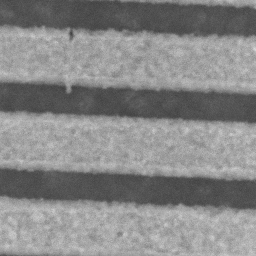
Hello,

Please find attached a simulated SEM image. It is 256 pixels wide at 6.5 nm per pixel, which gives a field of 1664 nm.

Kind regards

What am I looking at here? one or a few lines or trenches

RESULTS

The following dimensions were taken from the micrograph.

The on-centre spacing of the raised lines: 0.559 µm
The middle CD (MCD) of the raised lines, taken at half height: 286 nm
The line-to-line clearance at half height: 274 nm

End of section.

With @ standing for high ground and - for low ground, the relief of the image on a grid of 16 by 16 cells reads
----------------
----------------
@@@@@@@@@@@-----
@@@@@@@@@@@@@@@@
@@@@@@@@@@@@@@@@
----------------
----------------
@@@@------------
@@@@@@@@@@@@@@@@
@@@@@@@@@@@@@@@@
---------@@@@@@@
----------------
----------------
@@@@@@@@@@@@@@@@
@@@@@@@@@@@@@@@@
@@@@@@@@@@@@@@@@